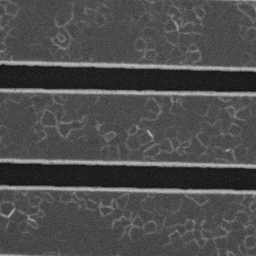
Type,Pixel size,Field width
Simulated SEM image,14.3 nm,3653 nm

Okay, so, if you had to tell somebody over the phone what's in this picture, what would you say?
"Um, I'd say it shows lines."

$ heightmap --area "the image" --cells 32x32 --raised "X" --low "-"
XXXXXXXXXXXXXXXXXXXXXXXXXXXXXXXX
XXXXXXXXXXXXXXXXXXXXXXXXXXXXXXXX
XXXXXXXXXXXXXXXXXXXXXXXXXXXXXXXX
XXXXXXXXXXXXXXXXXXXXXXXXXXXXXXXX
XXXXXXXXXXXXXXXXXXXXXXXXXXXXXXXX
XXXXXXXXXXXXXXXXXXXXXXXXXXXXXXXX
XXXXXXXXXXXXXXXXXXXXXXXXXXXXXXXX
XXXXXXXXXXXXXXXXXXXXXXXXXXXXXXXX
--------------------XXXXXXXXXXXX
--------------------------------
--------------------------------
XXXXXXXXXXXXXXXXXXXX------------
XXXXXXXXXXXXXXXXXXXXXXXXXXXXXXXX
XXXXXXXXXXXXXXXXXXXXXXXXXXXXXXXX
XXXXXXXXXXXXXXXXXXXXXXXXXXXXXXXX
XXXXXXXXXXXXXXXXXXXXXXXXXXXXXXXX
XXXXXXXXXXXXXXXXXXXXXXXXXXXXXXXX
XXXXXXXXXXXXXXXXXXXXXXXXXXXXXXXX
XXXXXXXXXXXXXXXXXXXXXXXXXXXXXXXX
XXXXXXXXXXXXXXXXXXXXXXXXXXXXXXXX
----------------XXXXXXXXXXXXXXXX
--------------------------------
--------------------------------
XXXXXXX-------------------------
XXXXXXXXXXXXXXXXXXXXXXXXXXXXXXXX
XXXXXXXXXXXXXXXXXXXXXXXXXXXXXXXX
XXXXXXXXXXXXXXXXXXXXXXXXXXXXXXXX
XXXXXXXXXXXXXXXXXXXXXXXXXXXXXXXX
XXXXXXXXXXXXXXXXXXXXXXXXXXXXXXXX
XXXXXXXXXXXXXXXXXXXXXXXXXXXXXXXX
XXXXXXXXXXXXXXXXXXXXXXXXXXXXXXXX
XXXXXXXXXXXXXXXXXXXXXXXXXXXXXXXX